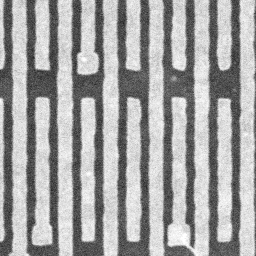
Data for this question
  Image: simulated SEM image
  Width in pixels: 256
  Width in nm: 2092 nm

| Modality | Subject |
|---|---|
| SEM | wiring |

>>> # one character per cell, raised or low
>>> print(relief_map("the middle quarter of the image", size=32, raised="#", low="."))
##..####..###...###...##...###..
##..####..###.........###.......
##........###.........###.......
##........###.........###.......
##........###.........###.......
##........###.........###.......
##........###........####.......
##........###........####.......
##........###........####.......
##...##...###...###..####..###..
##...##...###...###..####..###..
##...##...###...###..####..###..
##...##...###...###..####..###..
##...###..###...###..####..###..
##...###..###...###..####..###..
##...###..###...###..####..###..
##...###..###...###..####..###..
##...##...###...###...###..###..
##...##...###...###...###..###..
##...##...###...###...###..###..
##...##...###...###...###..###..
##...##...###...###...###..###..
##...##...###...###...###..###..
##...##...###...###...###..###..
##...##...###...###..####..###..
##...##...###...###..###...###..
##..###...###...###..####..###..
##..###...###...###..####..###..
##..###...###...###..####..###..
##...##...###...###...###..###..
##...##...###...###..####..###..
##...##...###...###..####..###..